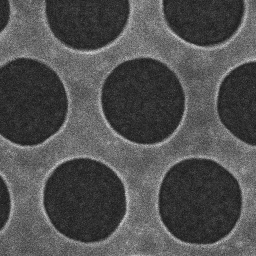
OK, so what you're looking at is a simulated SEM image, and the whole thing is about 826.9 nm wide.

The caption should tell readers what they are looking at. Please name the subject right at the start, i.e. holes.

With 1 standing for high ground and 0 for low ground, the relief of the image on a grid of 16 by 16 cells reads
0110000011000001
1110000011000001
1111000111110011
1111111111111111
0001111000011100
0000110000011100
0000110000001100
0000111000011100
0001111100011110
1111111111111111
1110000111100011
1110000011000001
0110000011000001
0110000011000001
1111000111100011
1111111111111111